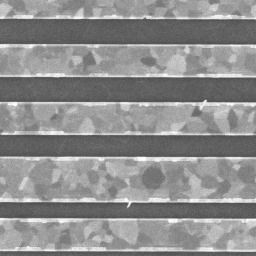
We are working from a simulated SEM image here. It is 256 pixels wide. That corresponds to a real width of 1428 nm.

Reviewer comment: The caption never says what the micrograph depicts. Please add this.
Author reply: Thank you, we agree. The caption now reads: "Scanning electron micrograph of parallel lines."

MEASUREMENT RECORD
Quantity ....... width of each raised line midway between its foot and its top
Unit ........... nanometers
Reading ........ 177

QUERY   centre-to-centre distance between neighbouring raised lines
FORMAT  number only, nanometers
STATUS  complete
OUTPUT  324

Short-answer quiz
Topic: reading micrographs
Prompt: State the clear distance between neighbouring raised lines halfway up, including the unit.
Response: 133 nanometers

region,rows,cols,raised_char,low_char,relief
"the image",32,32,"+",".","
++++++++++++++++++++++++++++++++
++++++++++++++++++++++++++++++++
................................
................................
................................
................................
++++++++++++++++++++++++++++++++
++++++++++++++++++++++++++++++++
++++++++++++++++++++++++++++++++
......++..........++++++++++++++
................................
................................
................................
++++++++++++++++++++++++++++++++
++++++++++++++++++++++++++++++++
++++++++++++++++++++++++++++++++
++++++++++++++++++++++++++++++++
................................
................................
................................
++++++++++++++++++++++++++++++++
++++++++++++++++++++++++++++++++
++++++++++++++++++++++++++++++++
++++++++++++++++++++++++++++++++
++++++++++++++++++++++++++++++++
................................
................................
++++++++++++++++++++++..........
++++++++++++++++++++++++++++++++
++++++++++++++++++++++++++++++++
++++++++++++++++++++++++++++++++
................................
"